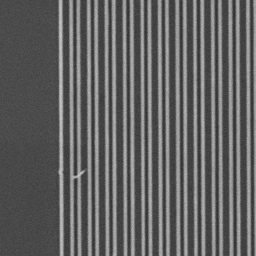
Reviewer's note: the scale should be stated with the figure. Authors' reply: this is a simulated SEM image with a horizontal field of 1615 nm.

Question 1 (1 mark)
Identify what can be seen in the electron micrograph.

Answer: parallel lines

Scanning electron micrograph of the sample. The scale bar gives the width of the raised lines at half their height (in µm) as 0.0181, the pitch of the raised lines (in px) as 8.92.